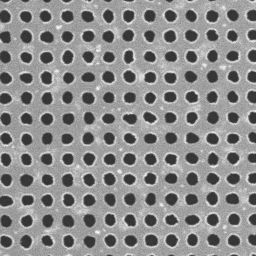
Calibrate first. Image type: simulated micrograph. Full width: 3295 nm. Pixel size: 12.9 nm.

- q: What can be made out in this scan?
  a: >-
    a regular array of holes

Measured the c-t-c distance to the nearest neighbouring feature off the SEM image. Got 258 nm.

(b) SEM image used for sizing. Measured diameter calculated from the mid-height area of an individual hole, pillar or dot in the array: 157 nm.